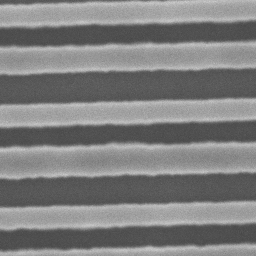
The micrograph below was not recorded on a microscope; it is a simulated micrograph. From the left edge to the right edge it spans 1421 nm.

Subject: lines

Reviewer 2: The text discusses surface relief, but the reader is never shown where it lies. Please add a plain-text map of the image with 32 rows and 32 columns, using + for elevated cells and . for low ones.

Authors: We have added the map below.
.......+..++++++++++++++++++++++
++++++++++++++++++++++++++++++++
+++++++++++++++++++++++++++++++.
................................
................................
.......................+++++++++
++++++++++++++++++++++++++++++++
++++++++++++++++++++++++++++++++
++++++++++++++++++++++++++......
................................
................................
................................
............................++++
++++++++++++++++++++++++++++++++
++++++++++++++++++++++++++++++++
+++++++++++++.+.................
................................
................................
.++.++++++++++++++++++++++++++++
++++++++++++++++++++++++++++++++
++++++++++++++++++++++++++++++++
++++++++++++++++++++++++++++++.+
................................
................................
................................
.....................+++++++++++
++++++++++++++++++++++++++++++++
++++++++++++++++++++++++++++++++
++..............................
................................
................................
...+++++++++++++++++++++++++++++